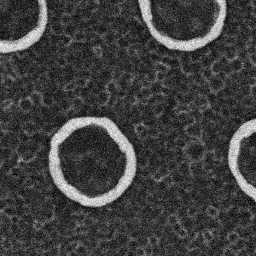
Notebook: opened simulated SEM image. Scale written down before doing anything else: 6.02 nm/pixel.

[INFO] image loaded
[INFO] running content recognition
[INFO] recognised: raised bodies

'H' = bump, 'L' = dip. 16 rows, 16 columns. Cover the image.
HHHLLLLLLHHHHHLL
HHHLLLLLLHHHHHLL
HHLLLLLLLLHHHLLL
LLLLLLLLLLLLLLLL
LLLLLLLLLLLLLLLL
LLLLLLLLLLLLLLLL
LLLLLLLLLLLLLLLL
LLLLLHLLLLLLLLLL
LLLLHHHHLLLLLLLH
LLLHHHHHLLLLLLLH
LLLHHHHHLLLLLLLH
LLLLHHHHLLLLLLLH
LLLLLHHLLLLLLLLL
LLLLLLLLLLLLLLLL
LLLLLLLLLLLLLLLL
LLLLLLLLLLLLLLLL